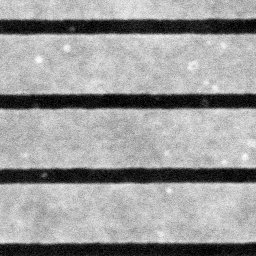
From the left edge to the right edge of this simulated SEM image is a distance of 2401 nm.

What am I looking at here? lines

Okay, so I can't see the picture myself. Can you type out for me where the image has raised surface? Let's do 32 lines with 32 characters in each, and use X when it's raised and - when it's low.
XXXXXXXXXXXXXXXXXXXXXXXXXXXXXXXX
XXXXXXXXXXXXXXXXXXXXXXXXXXXXXXXX
--------------------------------
--------------------------------
XXXXXXXXXXXXXXXXXXXXXXXXXXXXXXXX
XXXXXXXXXXXXXXXXXXXXXXXXXXXXXXXX
XXXXXXXXXXXXXXXXXXXXXXXXXXXXXXXX
XXXXXXXXXXXXXXXXXXXXXXXXXXXXXXXX
XXXXXXXXXXXXXXXXXXXXXXXXXXXXXXXX
XXXXXXXXXXXXXXXXXXXXXXXXXXXXXXXX
XXXXXXXXXXXXXXXXXXXXXXXXXXXXXXXX
XXXXXXXXXXXXXXXXXXXXXXXXXXXXXXXX
--------------------------------
--------------------------------
XXXXXXXXXXXXXXXXXXXXXXXXXXXXXXXX
XXXXXXXXXXXXXXXXXXXXXXXXXXXXXXXX
XXXXXXXXXXXXXXXXXXXXXXXXXXXXXXXX
XXXXXXXXXXXXXXXXXXXXXXXXXXXXXXXX
XXXXXXXXXXXXXXXXXXXXXXXXXXXXXXXX
XXXXXXXXXXXXXXXXXXXXXXXXXXXXXXXX
XXXXXXXXXXXXXXXXXXXXXXXXXXXXXXXX
--------------------------------
--------------------------------
XXXXXXXXXXXXXXXXXXXXXXXXXXXXXXXX
XXXXXXXXXXXXXXXXXXXXXXXXXXXXXXXX
XXXXXXXXXXXXXXXXXXXXXXXXXXXXXXXX
XXXXXXXXXXXXXXXXXXXXXXXXXXXXXXXX
XXXXXXXXXXXXXXXXXXXXXXXXXXXXXXXX
XXXXXXXXXXXXXXXXXXXXXXXXXXXXXXXX
XXXXXXXXXXXXXXXXXXXXXXXXXXXXXXXX
--------------------------------
--------------------------------